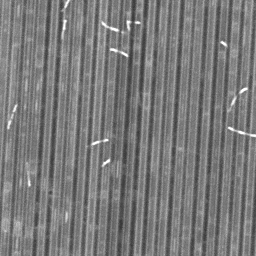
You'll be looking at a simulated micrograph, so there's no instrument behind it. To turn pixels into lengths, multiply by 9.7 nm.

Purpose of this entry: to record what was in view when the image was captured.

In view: parallel lines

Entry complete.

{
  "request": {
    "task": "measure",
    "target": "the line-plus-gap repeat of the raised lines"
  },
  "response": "117 nanometers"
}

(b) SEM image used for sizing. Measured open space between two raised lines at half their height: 52.1 nm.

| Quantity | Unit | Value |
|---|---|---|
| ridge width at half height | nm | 69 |